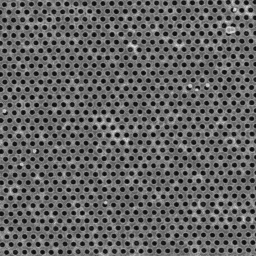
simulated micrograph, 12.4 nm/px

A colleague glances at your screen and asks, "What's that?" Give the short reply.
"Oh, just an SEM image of a regular array of holes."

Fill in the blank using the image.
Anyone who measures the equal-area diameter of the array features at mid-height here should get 64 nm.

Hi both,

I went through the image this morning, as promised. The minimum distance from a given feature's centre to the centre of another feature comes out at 107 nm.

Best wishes